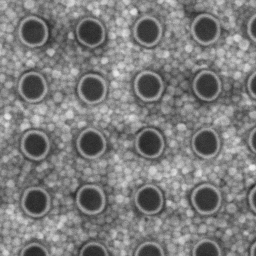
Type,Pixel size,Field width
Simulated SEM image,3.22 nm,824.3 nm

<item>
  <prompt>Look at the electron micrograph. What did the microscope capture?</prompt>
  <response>a regular array of raised bodies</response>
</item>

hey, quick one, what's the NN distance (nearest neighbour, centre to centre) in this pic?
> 179 nm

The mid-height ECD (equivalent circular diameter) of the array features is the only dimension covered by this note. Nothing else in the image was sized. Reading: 27.4 pixels